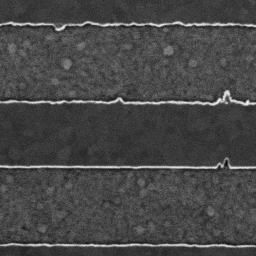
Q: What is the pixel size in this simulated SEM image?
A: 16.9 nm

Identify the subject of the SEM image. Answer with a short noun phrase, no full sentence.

one or a few lines or trenches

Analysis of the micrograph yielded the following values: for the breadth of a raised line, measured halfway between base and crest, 1100 nanometers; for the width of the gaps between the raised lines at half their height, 1320 nm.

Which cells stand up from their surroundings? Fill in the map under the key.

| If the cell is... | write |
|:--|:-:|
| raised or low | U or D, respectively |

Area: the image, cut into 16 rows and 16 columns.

UUUUUUUUUUUUUUUU
DUUUUDUUUUUUUUUU
DDDDDDDDDDDDDDDD
DDDDDDDDDDDDDDDD
DDDDDDDDDDDDDDDD
DDDDDDDDDDDDDDDD
UUUUUUUUUUUUUUUU
UUUUUUUUUUUUUUUU
UUUUUUUUUUUUUUUU
UUUUUUUUUUUUUUUU
DDDDDDDDDDDDDDDD
DDDDDDDDDDDDDDDD
DDDDDDDDDDDDDDDD
DDDDDDDDDDDDDDDD
DDDDDDDDDDDDDDDD
UUUUUUUUUUUUUUUU